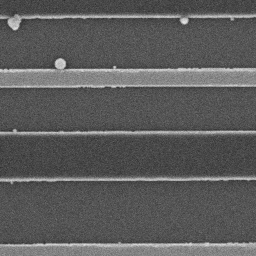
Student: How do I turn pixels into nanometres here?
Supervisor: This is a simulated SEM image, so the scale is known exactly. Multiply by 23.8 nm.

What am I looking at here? lines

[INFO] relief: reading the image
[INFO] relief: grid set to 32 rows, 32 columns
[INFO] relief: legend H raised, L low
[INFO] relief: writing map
HHHHHHHHHHHHHHHHHHHHHHHHHHHHHHHH
HHHHHHHHHHHHHHHHHHHHHHHHHHHHHHHH
LHHLLLLLLLLLLLLLLLLLLLLHLLLLLLLL
LLLLLLLLLLLLLLLLLLLLLLLLLLLLLLLL
LLLLLLLLLLLLLLLLLLLLLLLLLLLLLLLL
LLLLLLLLLLLLLLLLLLLLLLLLLLLLLLLL
LLLLLLLLLLLLLLLLLLLLLLLLLLLLLLLL
LLLLLLLHLLLLLLLLLLLLLLLLLLLLLLLL
LLLLLLLHLLLLLLLLLLLLLLLLLLLLLLLL
HHHHHHHHHHHHHHHHHHHHHHHHHHHHHHHH
HHHHHHHHHHHHHHHHHHHHHHHHHHHHHHHH
LLLLLLLLLLLLLLLLLLLLLLLLLLLLLLLL
LLLLLLLLLLLLLLLLLLLLLLLLLLLLLLLL
LLLLLLLLLLLLLLLLLLLLLLLLLLLLLLLL
LLLLLLLLLLLLLLLLLLLLLLLLLLLLLLLL
LLLLLLLLLLLLLLLLLLLLLLLLLLLLLLLL
LHLLLLLLLLLLLLHLLLHHHHHHHHHHHHHH
HHHHHHHHHHHHHHHHHHHHHHHHHHHHHHHH
HHHHHHHHHHHHHHHHHHHHHHHHHHHHHHHH
HHHHHHHHHHHHHHHHHHHHHHHHHHHHHHHH
HHHHHHHHHHHHHHHHHHHHHHHHHHHHHHHH
HHHHHHHHHHHHHHHHHHHHHHHHHHHHHHHH
HHHHHHHHHHHHHHHHHHHHHHHHHHHHHLLL
LLLLLLLLLLLLLLLLLLLLLLLLLLLLLLLL
LLLLLLLLLLLLLLLLLLLLLLLLLLLLLLLL
LLLLLLLLLLLLLLLLLLLLLLLLLLLLLLLL
LLLLLLLLLLLLLLLLLLLLLLLLLLLLLLLL
LLLLLLLLLLLLLLLLLLLLLLLLLLLLLLLL
LLLLLLLLLLLLLLLLLLLLLLLLLLLLLLLL
LLLLLLLLLLLLLLLLLLLLLLLLLLLLLLLL
LLLLLLLLLLLLLLLLLLLLLLLLLLLLLLLL
HHHHHHHHHHHHHHHHHHHHHHHHHHHHHHHH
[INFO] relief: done